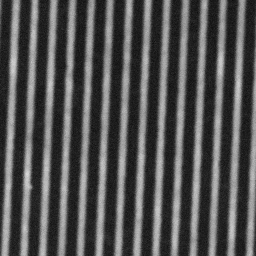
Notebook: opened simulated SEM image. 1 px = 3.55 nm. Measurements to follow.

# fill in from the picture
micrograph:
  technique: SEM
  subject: parallel lines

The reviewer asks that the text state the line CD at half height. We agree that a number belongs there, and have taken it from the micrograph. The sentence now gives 19.1 nanometres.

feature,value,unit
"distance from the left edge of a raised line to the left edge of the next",66.8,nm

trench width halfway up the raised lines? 13.4 px